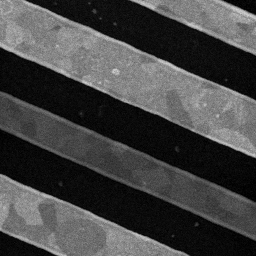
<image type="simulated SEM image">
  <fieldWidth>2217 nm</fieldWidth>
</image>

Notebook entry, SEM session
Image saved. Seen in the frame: lines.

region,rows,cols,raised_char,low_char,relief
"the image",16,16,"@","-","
@@@------@@@@@@-
@@@@@-------@@@@
@@@@@@@-------@@
-@@@@@@@@@------
----@@@@@@@@----
------@@@@@@@@--
@@------@@@@@@@@
@@@@-------@@@@@
-@@@@@-------@@@
---@@@@@@------@
------@@@@@-----
@-------@@@@@---
@@@@------@@@@@@
@@@@@@-------@@@
@@@@@@@@-------@
---@@@@@@@@-----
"